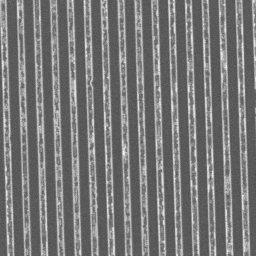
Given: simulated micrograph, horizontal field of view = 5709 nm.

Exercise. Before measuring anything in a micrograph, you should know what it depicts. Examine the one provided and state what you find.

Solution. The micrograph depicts parallel lines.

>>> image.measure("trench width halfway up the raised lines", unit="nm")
240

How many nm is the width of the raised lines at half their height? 136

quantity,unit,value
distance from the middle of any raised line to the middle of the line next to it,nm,376